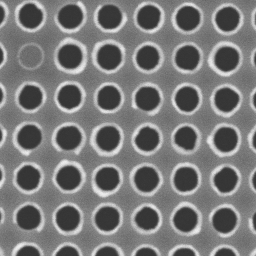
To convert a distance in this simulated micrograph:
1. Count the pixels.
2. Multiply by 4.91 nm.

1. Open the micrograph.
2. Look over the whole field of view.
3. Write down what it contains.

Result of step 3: a regular array of holes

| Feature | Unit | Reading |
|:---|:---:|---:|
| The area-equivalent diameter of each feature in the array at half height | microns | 0.117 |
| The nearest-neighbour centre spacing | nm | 192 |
